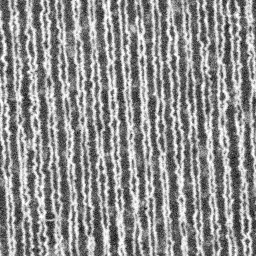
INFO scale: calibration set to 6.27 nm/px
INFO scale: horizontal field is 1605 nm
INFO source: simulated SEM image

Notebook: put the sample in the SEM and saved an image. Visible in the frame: parallel lines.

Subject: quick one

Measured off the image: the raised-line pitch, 15.6 pixels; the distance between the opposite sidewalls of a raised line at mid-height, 0.0375 micrometres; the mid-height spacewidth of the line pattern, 59.4 nm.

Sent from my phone